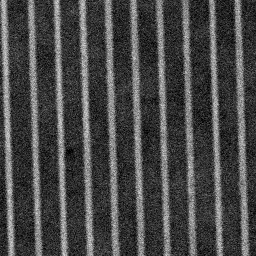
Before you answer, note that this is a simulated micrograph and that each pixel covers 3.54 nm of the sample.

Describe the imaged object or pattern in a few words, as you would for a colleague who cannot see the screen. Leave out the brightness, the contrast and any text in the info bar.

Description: parallel lines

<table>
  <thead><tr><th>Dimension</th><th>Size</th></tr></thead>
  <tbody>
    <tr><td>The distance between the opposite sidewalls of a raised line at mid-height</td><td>15.9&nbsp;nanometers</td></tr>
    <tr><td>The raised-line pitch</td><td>26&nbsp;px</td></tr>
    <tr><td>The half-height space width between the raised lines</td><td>77.4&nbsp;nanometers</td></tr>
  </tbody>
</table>